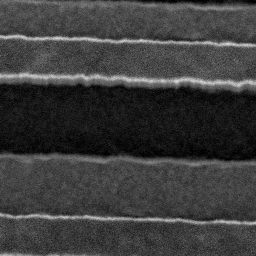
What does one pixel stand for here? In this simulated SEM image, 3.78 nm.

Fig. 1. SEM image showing lines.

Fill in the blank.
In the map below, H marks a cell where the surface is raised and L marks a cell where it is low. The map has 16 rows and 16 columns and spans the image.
HHHHHHHHHHHHHHHH
HHHHHHHHHHHHHHHH
HHHHHHHHHHHHHHHH
HHHHHHHHHHHHHHHH
HHHHHHHHHHHHHHHH
LLLLLLLLLLLLLLLL
LLLLLLLLLLLLLLLL
LLLLLLLLLLLLLLLL
LLLLLLLLLLLLLLLL
LLLLLLLLLLLLLLLL
HHHHHHHHHHHHHHHH
HHHHHHHHHHHHHHHH
HHHHHHHHHHHHHHHH
HHHHHHHHHHHHHHHH
HHHHHHHHHHHHHHHH
HHHHHHHHHHHHHHHH